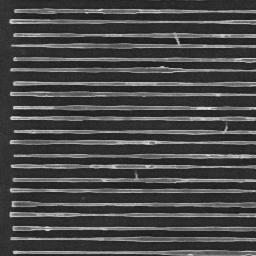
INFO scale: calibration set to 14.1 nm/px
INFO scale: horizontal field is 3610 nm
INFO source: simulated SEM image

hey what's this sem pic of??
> parallel lines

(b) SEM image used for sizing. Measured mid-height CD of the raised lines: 3 px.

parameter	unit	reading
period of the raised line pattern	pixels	12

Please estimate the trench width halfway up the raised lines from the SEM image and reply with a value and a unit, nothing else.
0.122 um